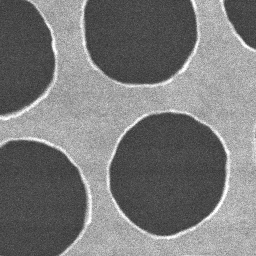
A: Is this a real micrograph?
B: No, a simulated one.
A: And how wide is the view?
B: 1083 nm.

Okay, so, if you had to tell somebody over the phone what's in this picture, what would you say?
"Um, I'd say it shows holes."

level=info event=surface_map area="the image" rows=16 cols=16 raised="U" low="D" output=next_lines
DDUUUDDDDDDDUUDD
DDDUUDDDDDDDUUDD
DDDUUDDDDDDDUUUD
DDDUUUDDDDDDUUUU
DDDUUUDDDDDUUUUU
DDDUUUUUUUUUUUUU
DDUUUUUUUUUUUUUU
UUUUUUUUUDDDUUUU
UUUUUUUUDDDDDDUU
DDDDUUUDDDDDDDUU
DDDDDUUDDDDDDDUU
DDDDDUUDDDDDDDUU
DDDDDDUDDDDDDDUU
DDDDDUUUDDDDDUUU
DDDDDUUUUDDUUUUU
DDDDUUUUUUUUUUUU